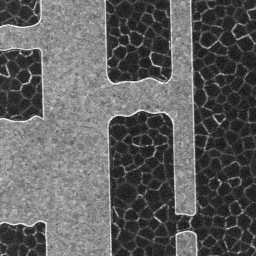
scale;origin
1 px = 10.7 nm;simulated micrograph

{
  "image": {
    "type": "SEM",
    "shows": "one or a few lines or trenches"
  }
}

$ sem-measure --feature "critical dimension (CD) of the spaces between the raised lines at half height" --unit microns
0.696